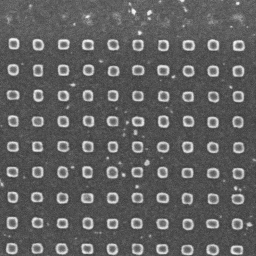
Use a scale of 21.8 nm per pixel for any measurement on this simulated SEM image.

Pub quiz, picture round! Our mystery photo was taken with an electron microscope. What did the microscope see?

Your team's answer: a regular array of raised bodies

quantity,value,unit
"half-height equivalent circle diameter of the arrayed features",230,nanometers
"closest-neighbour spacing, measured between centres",0.54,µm